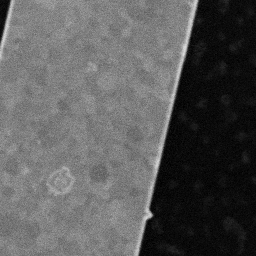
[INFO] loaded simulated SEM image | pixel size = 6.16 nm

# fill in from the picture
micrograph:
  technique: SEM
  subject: one or a few lines or trenches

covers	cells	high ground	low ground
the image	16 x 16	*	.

.***********....
************....
************....
***********.....
***********.....
***********.....
***********.....
**********......
**********......
**********......
**********......
**********......
*********.......
*********.......
*********.......
*********.......